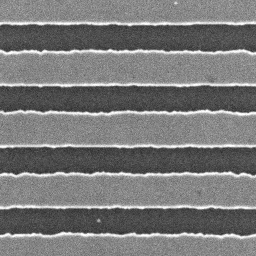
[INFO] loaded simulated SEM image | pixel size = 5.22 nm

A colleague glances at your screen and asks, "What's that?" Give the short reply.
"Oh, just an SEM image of lines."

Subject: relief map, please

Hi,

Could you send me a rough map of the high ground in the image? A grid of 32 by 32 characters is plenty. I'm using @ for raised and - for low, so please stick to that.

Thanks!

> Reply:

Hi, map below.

@@@@@@@@@@@@@@@@@@@@@@@@@@@@@@@@
@@@@@@@@@@@@@@@@@@@@@@@@@@@@@@@@
@@@@@@@@@@@@@@@@@@@@@@@@@@@@@@@@
--------------------------------
--------------------------------
--------------------------------
@@@@@@@@@@@@@@@@@@@@@@@@@@-@@@@-
@@@@@@@@@@@@@@@@@@@@@@@@@@@@@@@@
@@@@@@@@@@@@@@@@@@@@@@@@@@@@@@@@
@@@@@@@@@@@@@@@@@@@@@@@@@@@@@@@@
@@@@@@@@@@@@@@@@@@@@@@@@@@@@@@@@
--------------------------------
--------------------------------
--------------------------------
@@@@@@@@@@@@@@@@@@@@@@@@@@@@@@@@
@@@@@@@@@@@@@@@@@@@@@@@@@@@@@@@@
@@@@@@@@@@@@@@@@@@@@@@@@@@@@@@@@
@@@@@@@@@@@@@@@@@@@@@@@@@@@@@@@@
--------------------------------
--------------------------------
--------------------------------
--------------------------------
@@@@@@@@@@@@@@@@@@@@@@@@@@@@@@@@
@@@@@@@@@@@@@@@@@@@@@@@@@@@@@@@@
@@@@@@@@@@@@@@@@@@@@@@@@@@@@@@@@
@@@@@@@@@@@@@@@@@@@@@@@@@@@@@@@@
--------------------------------
--------------------------------
--------------------------------
@@@@@@@@@@@@@@@@@@@@@@@@@@@@@@-@
@@@@@@@@@@@@@@@@@@@@@@@@@@@@@@@@
@@@@@@@@@@@@@@@@@@@@@@@@@@@@@@@@